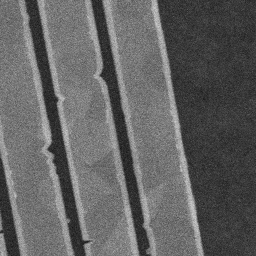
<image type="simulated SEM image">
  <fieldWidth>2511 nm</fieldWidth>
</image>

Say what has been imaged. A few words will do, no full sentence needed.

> one or a few lines or trenches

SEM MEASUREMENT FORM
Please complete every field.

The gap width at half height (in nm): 178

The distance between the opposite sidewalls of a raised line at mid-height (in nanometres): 458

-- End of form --